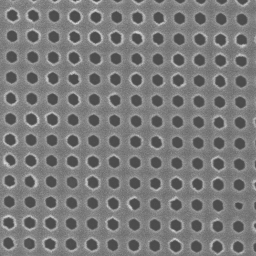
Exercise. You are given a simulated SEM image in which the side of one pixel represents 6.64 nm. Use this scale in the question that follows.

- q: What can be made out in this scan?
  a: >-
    a regular array of holes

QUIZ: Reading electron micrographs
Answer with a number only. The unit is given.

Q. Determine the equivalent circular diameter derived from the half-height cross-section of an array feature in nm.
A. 72.2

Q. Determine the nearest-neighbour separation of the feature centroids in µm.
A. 0.136